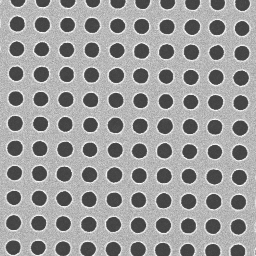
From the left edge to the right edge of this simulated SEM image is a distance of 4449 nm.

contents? a regular array of holes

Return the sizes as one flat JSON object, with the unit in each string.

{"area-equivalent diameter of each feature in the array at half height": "260 nm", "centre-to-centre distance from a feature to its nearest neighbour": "428 nm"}